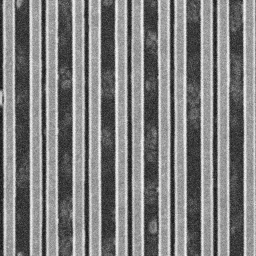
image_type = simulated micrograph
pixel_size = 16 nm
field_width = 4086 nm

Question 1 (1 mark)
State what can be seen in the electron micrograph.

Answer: parallel lines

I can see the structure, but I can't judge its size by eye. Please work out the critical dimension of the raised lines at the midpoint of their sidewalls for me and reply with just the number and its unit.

0.156 microns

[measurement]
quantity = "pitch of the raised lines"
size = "349 nanometers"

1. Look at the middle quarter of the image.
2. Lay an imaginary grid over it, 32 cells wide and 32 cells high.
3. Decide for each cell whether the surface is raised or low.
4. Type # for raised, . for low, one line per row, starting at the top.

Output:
..###..##....##..###....##..##..
..###..##....##..###....##..##..
..###..##....##..###....##..##..
..###..##....##..###....##..##..
..###..##....##..###....##..##..
..###..##....##..###....##..##..
..###..##....##..###....##..##..
..###..##....##..###....##..##..
..###..##....##..###....##..##..
..###..##....##..###....##..##..
..###..##....##..###....##..##..
..###..##....##..###....##..##..
..###..##....##..###....##..##..
..###..##....##..###....##..##..
..###..##....##..###....##..##..
..###..##....##..###....##..##..
..###..##....##..###....##..##..
..###..##....##..###....##..##..
..###..##....##..###....##..##..
..###..##....##..###....##..##..
..###..##....##..###....##..##..
...##..##....##..###....##..##..
...##..##....##..###....##..##..
...##..##....##..###....##..##..
...##..##....##..###....##..##..
...##..##....##..###....##..##..
...##..##....##..###....##..##..
...##..##....##..###....##..##..
...##..##....##..###....##..##..
...##..##....##..###....##..##..
...##..##....##..###....##..##..
...##..##....##..###....##..##..